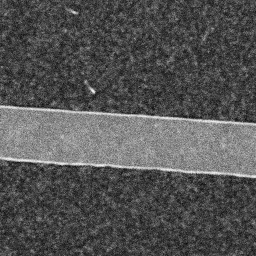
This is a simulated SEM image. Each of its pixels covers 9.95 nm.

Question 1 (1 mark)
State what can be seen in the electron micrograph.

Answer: one or a few lines or trenches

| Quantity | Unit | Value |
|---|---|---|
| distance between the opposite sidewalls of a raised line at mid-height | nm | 524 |